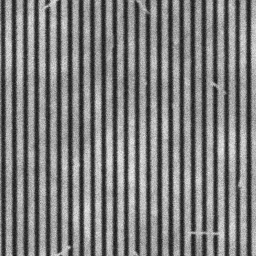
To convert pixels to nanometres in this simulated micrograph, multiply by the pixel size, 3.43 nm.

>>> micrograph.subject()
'parallel lines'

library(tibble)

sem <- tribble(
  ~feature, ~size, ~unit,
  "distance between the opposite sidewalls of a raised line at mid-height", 0.021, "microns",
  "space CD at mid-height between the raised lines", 17.6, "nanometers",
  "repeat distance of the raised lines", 0.0384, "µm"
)